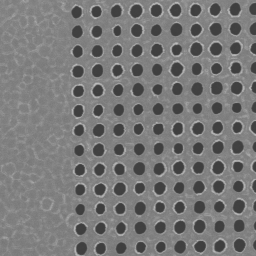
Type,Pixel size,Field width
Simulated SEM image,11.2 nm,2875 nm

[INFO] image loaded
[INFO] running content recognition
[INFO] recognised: a regular array of holes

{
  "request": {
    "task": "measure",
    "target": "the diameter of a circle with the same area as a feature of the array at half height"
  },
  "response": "125 nm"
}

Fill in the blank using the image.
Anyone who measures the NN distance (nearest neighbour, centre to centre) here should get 218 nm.